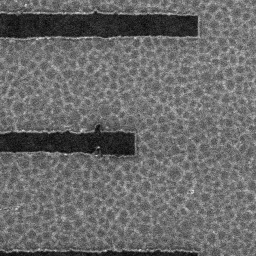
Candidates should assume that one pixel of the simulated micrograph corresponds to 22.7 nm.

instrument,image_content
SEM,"one or a few lines or trenches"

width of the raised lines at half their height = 539 nm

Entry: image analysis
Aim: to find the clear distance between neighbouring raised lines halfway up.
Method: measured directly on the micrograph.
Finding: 2140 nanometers